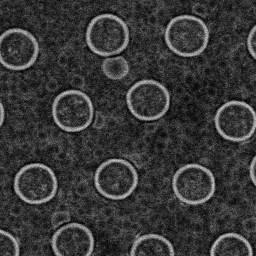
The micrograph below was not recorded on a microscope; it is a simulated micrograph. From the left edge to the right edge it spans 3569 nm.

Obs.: a regular array of raised bodies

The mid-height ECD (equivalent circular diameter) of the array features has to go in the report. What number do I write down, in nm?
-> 540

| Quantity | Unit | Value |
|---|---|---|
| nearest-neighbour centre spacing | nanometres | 1060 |